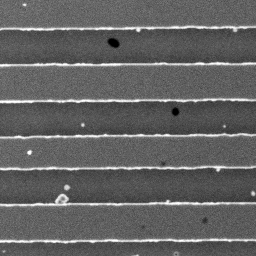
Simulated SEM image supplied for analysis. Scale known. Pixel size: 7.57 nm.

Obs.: lines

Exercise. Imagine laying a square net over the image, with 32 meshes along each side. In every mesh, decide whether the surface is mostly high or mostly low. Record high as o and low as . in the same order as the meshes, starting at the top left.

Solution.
oooooooooooooooooooooooooooooooo
oooooooooooooooooooooooooooooooo
oooooooooooooooooooooooooooooooo
ooooooooooooooooo.oo............
................................
................................
................................
................................
oooooooooooooooooooooooooooooooo
oooooooooooooooooooooooooooooooo
oooooooooooooooooooooooooooooooo
oooooooooooooooooooooooooooooooo
ooooooooooooooooooooooooooo.oooo
................................
................................
................................
................................
oooooooooooooooooooooooooooooooo
oooooooooooooooooooooooooooooooo
oooooooooooooooooooooooooooooooo
oooooooooooooooooooooooooooooooo
................................
................................
................................
................................
..................oooooooooooooo
oooooooooooooooooooooooooooooooo
oooooooooooooooooooooooooooooooo
oooooooooooooooooooooooooooooooo
oooooooooooooooooooooooooooooooo
................................
................................